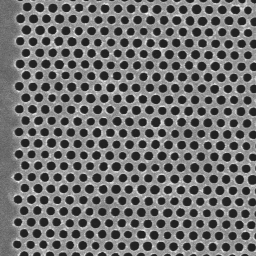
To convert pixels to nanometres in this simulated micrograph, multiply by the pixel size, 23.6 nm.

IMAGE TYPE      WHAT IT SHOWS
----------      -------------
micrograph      a regular array of holes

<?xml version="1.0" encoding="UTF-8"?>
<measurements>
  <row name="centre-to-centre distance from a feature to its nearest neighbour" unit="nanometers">295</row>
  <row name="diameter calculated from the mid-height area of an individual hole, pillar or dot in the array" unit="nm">211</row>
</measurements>